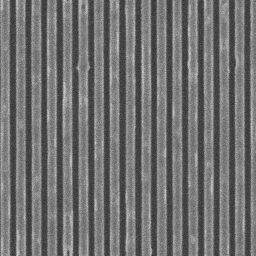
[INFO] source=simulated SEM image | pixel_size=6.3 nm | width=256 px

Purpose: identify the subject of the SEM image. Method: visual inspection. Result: parallel lines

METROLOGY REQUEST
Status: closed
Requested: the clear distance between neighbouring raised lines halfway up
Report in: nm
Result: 40.1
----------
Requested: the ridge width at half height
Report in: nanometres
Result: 57.5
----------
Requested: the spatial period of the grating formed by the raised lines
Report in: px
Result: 15.6